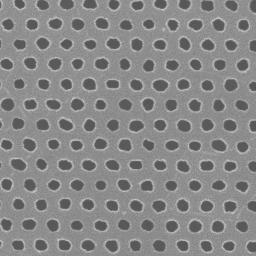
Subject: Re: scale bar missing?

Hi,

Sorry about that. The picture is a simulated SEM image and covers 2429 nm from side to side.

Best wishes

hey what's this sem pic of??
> a regular array of holes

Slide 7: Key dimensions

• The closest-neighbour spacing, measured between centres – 0.215 um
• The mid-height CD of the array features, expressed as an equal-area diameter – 109 nm